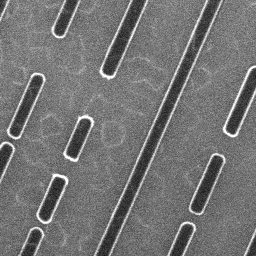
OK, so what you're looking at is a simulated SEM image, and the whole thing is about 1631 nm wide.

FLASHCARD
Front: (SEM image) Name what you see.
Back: one or a few lines or trenches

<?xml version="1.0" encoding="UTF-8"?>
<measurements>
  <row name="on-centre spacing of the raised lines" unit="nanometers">429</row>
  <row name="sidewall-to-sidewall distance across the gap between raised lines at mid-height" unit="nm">341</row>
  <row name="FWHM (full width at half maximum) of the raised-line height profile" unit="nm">91.5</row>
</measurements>